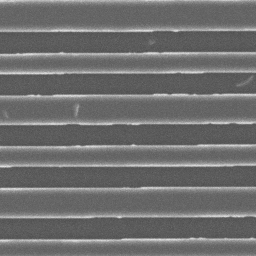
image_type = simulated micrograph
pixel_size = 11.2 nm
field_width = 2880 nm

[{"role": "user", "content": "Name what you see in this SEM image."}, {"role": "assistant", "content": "lines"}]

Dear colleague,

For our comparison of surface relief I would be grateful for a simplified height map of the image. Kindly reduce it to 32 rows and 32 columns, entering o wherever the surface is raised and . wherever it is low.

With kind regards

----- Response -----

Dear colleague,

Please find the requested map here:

oooooooooooooooooooooooooooooooo
oooooooooooooooooooooooooooooooo
oooooooooooooooooooooooooooooooo
oooooooooooooooooooooooooooooooo
................................
................................
................................
oooooooooooooooooooooooooooooooo
oooooooooooooooooooooooooooooooo
................................
................................
................................
oooooooooooooooooooooooooooooooo
oooooooooooooooooooooooooooooooo
oooooooooooooooooooooooooooooooo
oooooooo..oooo..oo..............
................................
................................
oooooooooooooooooooooooooooooooo
oooooooooooooooooooooooooooooooo
oooooooooooooooooooooooooooooooo
................................
................................
.................ooooooooooooooo
oooooooooooooooooooooooooooooooo
oooooooooooooooooooooooooooooooo
oooooooooooooooooooooooooooooooo
................................
................................
................................
oooooooooooooooooooooooooooooooo
oooooooooooooooooooooooooooooooo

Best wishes